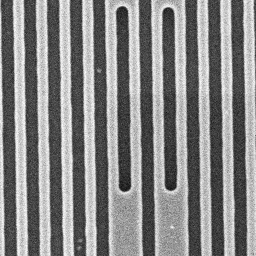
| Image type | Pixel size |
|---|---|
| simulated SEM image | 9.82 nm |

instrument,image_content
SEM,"groups of lines, slits or small figures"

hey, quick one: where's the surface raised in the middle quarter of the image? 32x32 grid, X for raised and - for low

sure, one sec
XX---XX----XX---XXX---XXX---XX--
XX---XX----XX---XXX---XXX---XX--
XX---XX----XX---XXX---XXX---XX--
XX---XX----XX----XX---XXX---XX--
XX---XX----XX---XXX---XXX---XX--
XX---XX----XX---XXX---XXX---XX--
XX---XX----XX---XXX---XXX---XX--
XX---XX----XX----XX---XXX---XX--
XX---XX----XX----XX---XXX---XXX-
XX---XX----XX----XX---XXX---XXX-
XX---XX----XX----XX---XXX---XXX-
XX---XX----XX----XX---XXX---XXX-
XX---XX----XX----XX---XXX---XXX-
XX---XX----XX----XX---XXX---XXX-
XX---XX----XX----XX---XXX---XXX-
XX---XX----XX----XX---XXX---XXX-
XX---XX----XX----XX----XX---XXX-
XX---XX----XX----XX----XX---XXX-
XX---XX----XX----XX---XXX---XXX-
XX---XX----XX----XX---XXX---XXX-
XX---XX----XX----XX----XX---XXX-
XX---XXX---XX----XX----XX---XXX-
XX---XXX---XX----XX----XX---XXX-
XX---XXX---XX----XX----XX---XXX-
XX---XXX---XX----XX----XX---XXX-
XX---XXX---XX----XX----XX---XXX-
XX---XXX---XX----XX----XX----XX-
XX---XXX---XX----XX----XX---XXX-
XX---XXX---XXX---XX----XX---XXX-
XX---XXX---XXX---XX----XX---XXX-
XX---XXX---XX----XX----XX---XXX-
XX---XXX---XXX--XXX----XXX--XXX-